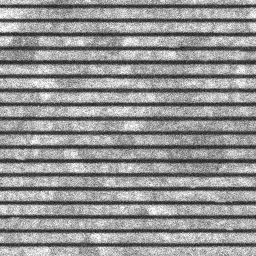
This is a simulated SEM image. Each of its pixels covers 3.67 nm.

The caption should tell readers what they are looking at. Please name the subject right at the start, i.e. parallel lines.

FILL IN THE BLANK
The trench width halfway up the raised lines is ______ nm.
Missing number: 17.4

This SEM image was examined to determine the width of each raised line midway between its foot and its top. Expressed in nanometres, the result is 35.3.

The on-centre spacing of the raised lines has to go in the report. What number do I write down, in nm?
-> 51.5